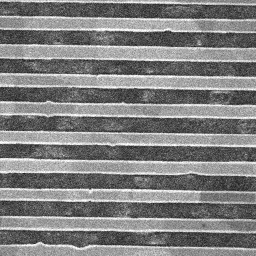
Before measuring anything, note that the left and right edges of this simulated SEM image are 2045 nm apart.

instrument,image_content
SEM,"parallel lines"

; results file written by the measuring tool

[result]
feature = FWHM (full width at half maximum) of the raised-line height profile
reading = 95.9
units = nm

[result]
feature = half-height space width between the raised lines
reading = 135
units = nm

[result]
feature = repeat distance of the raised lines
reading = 228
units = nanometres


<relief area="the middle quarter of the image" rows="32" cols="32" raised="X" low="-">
--------------------------------
--------------------------------
--------------------------------
XXXXXXXXXXXXXXXXXXXXXXXXXXXXXXXX
XXXXXXXXXXXXXXXXXXXXXXXXXXXXXXXX
----XXXXXXXXXXXXXXXXXXXXXXXXXXXX
--------------------------------
--------------------------------
--------------------------------
--------------------------------
XXXXXXXXXXXXXXXXXXXXXXXXXXXXXX--
XXXXXXXXXXXXXXXXXXXXXXXXXXXXXXXX
XXXXXXXXXXXXXXXXXXXXXXXXXXXXXXXX
--------------------------------
--------------------------------
--------------------------------
--------------------------------
XXXXXXXXXXXXXXX----------X------
XXXXXXXXXXXXXXXXXXXXXXXXXXXXXXXX
XXXXXXXXXXXXXXXXXXXXXXXXXXXXXXXX
--------------------------------
--------------------------------
--------------------------------
--------------------------------
XXXXXXXXXXXXXXXX----------------
XXXXXXXXXXXXXXXXXXXXXXXXXXXXXXXX
XXXXXXXXXXXXXXXXXXXXXXXXXXXXXXXX
--------------------------------
--------------------------------
--------------------------------
--------------------------------
X-------------------------------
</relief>